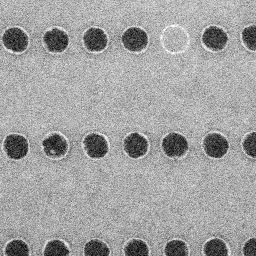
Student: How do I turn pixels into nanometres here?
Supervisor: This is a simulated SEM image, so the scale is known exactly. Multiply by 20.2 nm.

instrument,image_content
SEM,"a regular array of raised bodies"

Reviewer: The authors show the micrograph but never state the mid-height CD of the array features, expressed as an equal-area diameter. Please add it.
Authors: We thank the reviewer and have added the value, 27.1 px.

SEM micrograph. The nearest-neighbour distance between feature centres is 0.809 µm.